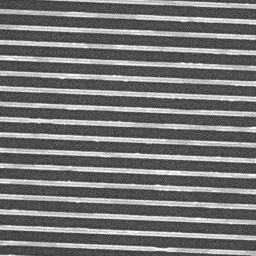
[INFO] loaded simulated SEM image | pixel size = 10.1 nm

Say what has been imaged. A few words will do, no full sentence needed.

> parallel lines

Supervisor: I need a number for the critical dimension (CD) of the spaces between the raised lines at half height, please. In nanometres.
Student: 118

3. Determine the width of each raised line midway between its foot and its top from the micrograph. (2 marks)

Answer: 41.4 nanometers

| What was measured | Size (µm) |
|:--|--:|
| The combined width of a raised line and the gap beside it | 0.155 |